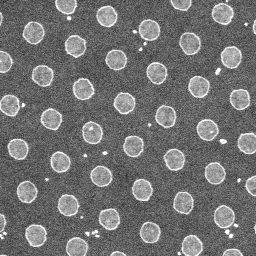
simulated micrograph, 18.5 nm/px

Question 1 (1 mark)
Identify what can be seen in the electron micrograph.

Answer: a regular array of raised bodies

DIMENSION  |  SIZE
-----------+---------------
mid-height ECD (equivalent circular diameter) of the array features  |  374 nanometers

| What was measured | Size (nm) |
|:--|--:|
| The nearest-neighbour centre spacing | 797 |